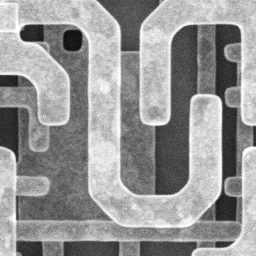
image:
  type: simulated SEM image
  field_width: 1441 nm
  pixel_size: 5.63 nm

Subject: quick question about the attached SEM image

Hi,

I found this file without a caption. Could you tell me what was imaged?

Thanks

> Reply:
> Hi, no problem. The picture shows wiring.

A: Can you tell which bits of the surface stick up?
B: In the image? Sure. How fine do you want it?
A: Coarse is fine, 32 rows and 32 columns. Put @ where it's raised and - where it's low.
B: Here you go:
@@@@@@@@@@@@--------@@@@@@@@@@@@
@@@@@@@@@@@@@------@@@@@@@@@@@@@
@@@@@@@@@@@@@@----@@@@@@@@@@@@@@
@@@-------@@@@@---@@@@@-------@@
@@@--------@@@@---@@@@--------@@
@@@@@@-----@@@@---@@@--------@@@
@@@@@@-----@@@@---@@@-------@@@@
@@@@@@@----@@@@---@@@--------@@@
@@@@@@@@---@@@@---@@@---------@@
---@@@@@@--@@@@---@@@---------@@
----@@@@@--@@@@---@@@---------@@
@@@@@@@@@--@@@@---@@@-------@@@@
@@@@@@@@@--@@@@---@@@---@@@-@@@@
---@@@@@@--@@@@---@@@---@@@@--@@
----@@@@@--@@@@---@@@---@@@@--@@
----@@@@---@@@@---@@----@@@@---@
----@@-----@@@@---------@@@@----
----@@-----@@@@---------@@@@----
@---@@-----@@@@---------@@@@---@
@@---------@@@@---------@@@@--@@
@@---------@@@@---------@@@@--@@
@@---------@@@@---------@@@@--@@
@@@@@@-----@@@@---------@@@@@@@@
@@@@@@-----@@@@@-------@@@@@@@@@
@@---------@@@@@@@---@@@@@@---@@
@@----------@@@@@@@@@@@@@@@---@@
@@-----------@@@@@@@@@@@@@----@@
@@------------@@@@@@@@@@@-----@@
@@@@@@@@@@@@@@@@@@@@@@@@@@@@@@@@
@@@@@@@@@@@@@@@@@@@@@@@@@@@@@@@@
@@---------------------------@@@
@@----------------------@@@@@@@@